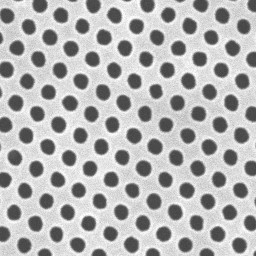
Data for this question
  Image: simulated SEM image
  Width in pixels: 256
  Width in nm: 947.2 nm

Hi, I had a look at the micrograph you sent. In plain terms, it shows a regular array of holes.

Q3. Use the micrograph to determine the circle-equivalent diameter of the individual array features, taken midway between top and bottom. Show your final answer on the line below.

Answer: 58.5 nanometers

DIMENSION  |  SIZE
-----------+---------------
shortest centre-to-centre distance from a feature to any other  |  88.2 nm